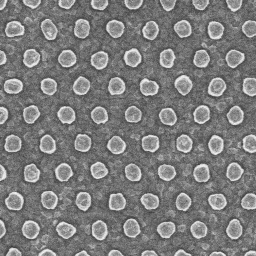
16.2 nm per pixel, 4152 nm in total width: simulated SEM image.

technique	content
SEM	a regular array of raised bodies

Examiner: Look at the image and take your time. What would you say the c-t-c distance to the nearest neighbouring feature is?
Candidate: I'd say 0.519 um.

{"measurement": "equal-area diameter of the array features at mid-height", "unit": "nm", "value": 267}